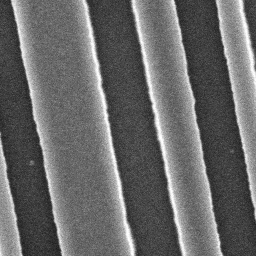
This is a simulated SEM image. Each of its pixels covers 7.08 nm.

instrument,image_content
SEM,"lines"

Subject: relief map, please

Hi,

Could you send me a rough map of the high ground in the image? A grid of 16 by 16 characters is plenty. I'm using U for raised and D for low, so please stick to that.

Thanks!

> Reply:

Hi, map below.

DUUUUDDDUUUDDDUD
DUUUUUDDDUUDDDUD
DUUUUUDDDUUDDDUD
DUUUUUDDDUUUDDUU
DDUUUUDDDUUUDDUU
DDUUUUDDDUUUDDDU
DDUUUUUDDDUUDDDU
DDUUUUUDDDUUDDDU
DDUUUUUDDDUUDDDU
DDDUUUUDDDUUUDDU
DDDUUUUDDDUUUDDU
UDDUUUUDDDDUUDDD
UDDUUUUUDDDUUDDD
UDDUUUUUDDDUUDDD
UDDDUUUUDDDUUUDD
UDDDUUUUDDDUUUDD